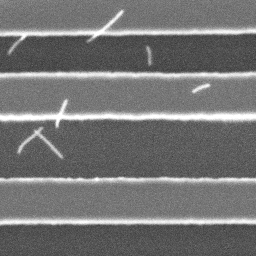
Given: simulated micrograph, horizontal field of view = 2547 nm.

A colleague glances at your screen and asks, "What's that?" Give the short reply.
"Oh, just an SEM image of lines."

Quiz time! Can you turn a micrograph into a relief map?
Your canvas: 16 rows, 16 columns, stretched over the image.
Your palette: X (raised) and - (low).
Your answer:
XXXXXXXXXXXXXXXX
XXXXXXXXXXXXXXXX
----------------
----------------
----------------
XXXXXXXXXXXXXXXX
XXXXXXXXXXXXXXXX
----------------
----------------
----------------
----------------
XXXXXXXXXXXXXXXX
XXXXXXXXXXXXXXXX
XXXXXXXXXXXXXXXX
----------------
----------------